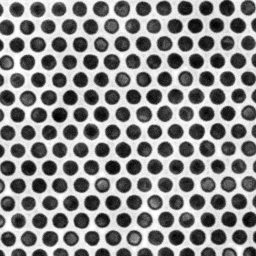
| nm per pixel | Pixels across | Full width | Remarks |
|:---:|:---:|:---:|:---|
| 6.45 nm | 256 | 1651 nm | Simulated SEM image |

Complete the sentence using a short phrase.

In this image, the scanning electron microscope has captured a regular array of holes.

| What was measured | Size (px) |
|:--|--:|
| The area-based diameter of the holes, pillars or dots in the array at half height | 16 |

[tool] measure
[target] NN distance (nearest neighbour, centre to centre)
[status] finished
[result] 130 nanometres